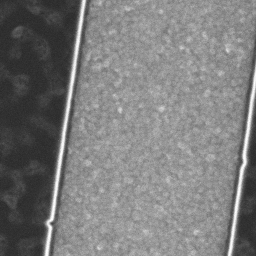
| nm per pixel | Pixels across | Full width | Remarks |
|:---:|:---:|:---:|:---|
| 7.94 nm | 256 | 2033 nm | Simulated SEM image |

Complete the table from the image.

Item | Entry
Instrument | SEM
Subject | one or a few lines or trenches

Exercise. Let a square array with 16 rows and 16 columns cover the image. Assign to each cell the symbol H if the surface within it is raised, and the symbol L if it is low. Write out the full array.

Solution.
HHHHHLLLLLLLLLLL
HHHHHLLLLLLLLLLL
HHHHHLLLLLLLLLLL
HHHHHLLLLLLLLLLL
HHHHHLLLLLLLLLLL
HHHHLLLLLLLLLLLL
HHHHLLLLLLLLLLLL
HHHHLLLLLLLLLLLL
HHHHLLLLLLLLLLLH
HHHHLLLLLLLLLLLH
HHHHLLLLLLLLLLLH
HHHHLLLLLLLLLLLH
HHHLLLLLLLLLLLLH
HHHLLLLLLLLLLLLH
HHHLLLLLLLLLLLLH
HHHLLLLLLLLLLLHH